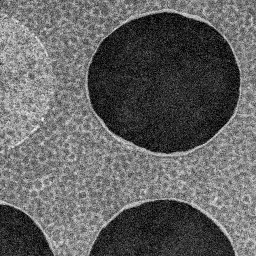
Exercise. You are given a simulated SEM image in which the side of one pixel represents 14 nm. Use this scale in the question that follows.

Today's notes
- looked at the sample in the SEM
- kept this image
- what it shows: holes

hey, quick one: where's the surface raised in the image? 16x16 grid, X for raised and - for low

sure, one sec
XXXXXXXXXXXXXXXX
XXXXXXXX-----XXX
XXXXXX--------XX
XXXXXX---------X
XXXXXX---------X
XXXXXX---------X
XXXXXX---------X
XXXXXX--------XX
XXXXXXX------XXX
XXXXXXXXXX--XXXX
XXXXXXXXXXXXXXXX
XXXXXXXXXXXXXXXX
XXXXXXXXXX-XXXXX
--XXXXX------XXX
---XXX--------XX
---XXX---------X